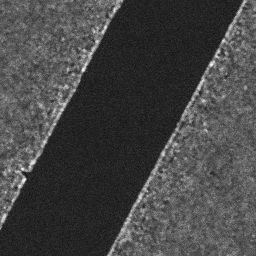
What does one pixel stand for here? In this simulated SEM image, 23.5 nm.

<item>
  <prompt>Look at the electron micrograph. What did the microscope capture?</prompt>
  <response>one or a few lines or trenches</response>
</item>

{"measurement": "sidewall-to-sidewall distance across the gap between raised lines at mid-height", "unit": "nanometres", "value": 2590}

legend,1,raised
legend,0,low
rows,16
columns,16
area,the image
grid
1111111000000001
1111111000000001
1111110000000011
1111110000000111
1111100000000111
1111100000001111
1111000000001111
1111000000011111
1110000000011111
1100000000111111
1100000000111111
1000000001111111
1000000001111111
0000000011111111
0000000011111111
0000000111111111